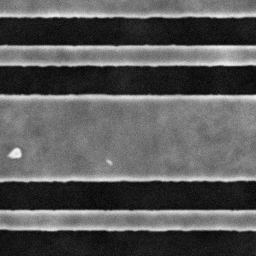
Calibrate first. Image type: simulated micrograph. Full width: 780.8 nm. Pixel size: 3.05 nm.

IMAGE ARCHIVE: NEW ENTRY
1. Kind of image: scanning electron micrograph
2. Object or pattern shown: lines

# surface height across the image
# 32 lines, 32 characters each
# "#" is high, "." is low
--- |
################################
################################
................................
................................
................................
................................
################################
################################
................................
................................
................................
................................
################################
################################
################################
################################
################################
################################
################################
################################
################################
################################
################################
................................
................................
................................
################################
################################
################################
................................
................................
................................